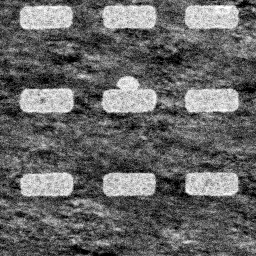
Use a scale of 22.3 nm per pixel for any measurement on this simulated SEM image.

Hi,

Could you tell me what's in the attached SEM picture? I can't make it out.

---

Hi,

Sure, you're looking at a regular array of raised bodies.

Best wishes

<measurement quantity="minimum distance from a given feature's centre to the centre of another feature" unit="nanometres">1840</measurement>